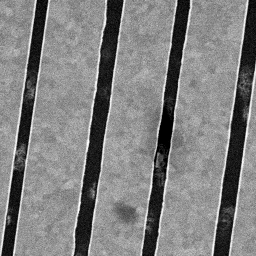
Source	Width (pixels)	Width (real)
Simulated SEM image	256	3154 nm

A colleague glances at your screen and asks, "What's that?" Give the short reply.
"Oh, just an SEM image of one or a few lines or trenches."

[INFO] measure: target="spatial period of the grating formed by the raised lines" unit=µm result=0.861